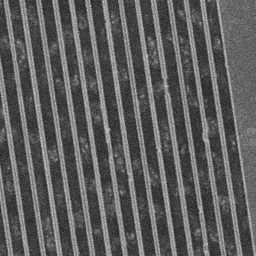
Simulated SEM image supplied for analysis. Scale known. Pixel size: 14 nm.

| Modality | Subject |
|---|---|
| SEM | parallel lines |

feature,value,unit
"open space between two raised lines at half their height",182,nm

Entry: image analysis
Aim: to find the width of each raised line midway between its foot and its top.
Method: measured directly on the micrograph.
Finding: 41.6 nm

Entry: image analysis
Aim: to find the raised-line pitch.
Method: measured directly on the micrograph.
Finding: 0.227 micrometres